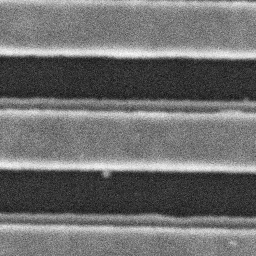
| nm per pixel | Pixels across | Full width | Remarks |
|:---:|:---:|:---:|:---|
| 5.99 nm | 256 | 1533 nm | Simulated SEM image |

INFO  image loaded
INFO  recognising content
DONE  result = lines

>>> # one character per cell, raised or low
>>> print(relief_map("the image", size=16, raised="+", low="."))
++++++++++++++++
++++++++++++++++
++++++++++++++++
.......+++++++++
................
................
++++++++++++++++
++++++++++++++++
++++++++++++++++
++++++++++++++++
..++++++++++++++
................
................
+++++...........
++++++++++++++++
++++++++++++++++